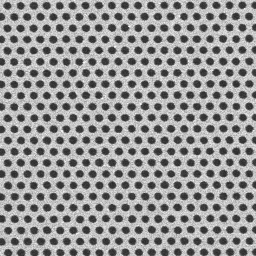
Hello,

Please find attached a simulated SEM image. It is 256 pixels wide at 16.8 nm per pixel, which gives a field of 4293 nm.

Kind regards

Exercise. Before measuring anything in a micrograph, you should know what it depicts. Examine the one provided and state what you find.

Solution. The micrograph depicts a regular array of holes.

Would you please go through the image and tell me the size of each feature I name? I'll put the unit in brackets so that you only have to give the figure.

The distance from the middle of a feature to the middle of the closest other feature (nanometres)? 213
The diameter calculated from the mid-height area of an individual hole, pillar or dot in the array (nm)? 135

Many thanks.